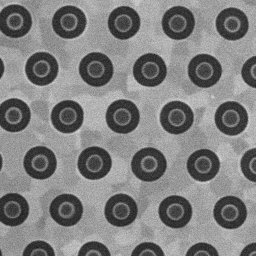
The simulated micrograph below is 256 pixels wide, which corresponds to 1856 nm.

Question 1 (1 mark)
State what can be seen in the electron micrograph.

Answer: an array of small figures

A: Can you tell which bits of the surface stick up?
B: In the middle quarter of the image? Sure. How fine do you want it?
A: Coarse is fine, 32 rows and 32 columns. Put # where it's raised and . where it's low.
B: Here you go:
####..####..#####...###...#####.
####..####...####...####..#####.
####..####..#####...###...#####.
####........#####....#...######.
#####......#######.......#######
#######...##########...#########
################################
################################
################################
...#########.....########.....##
....#######.......######.......#
##...######...##...#####...##...
###..#####...###...#####..####..
###..#####...###...####...####..
##...#####...###...#####...###..
....#######.......######........
....########......#######......#
..############.############..###
################################
################################
#######.########################
#####......########.....########
####.......#######.......#######
###...###...#####...##...######.
###...####..#####...###...#####.
###...####..#####...###...####..
###...###...#####...##....#####.
####.......######........######.
#####.....########......########
####################..##########
################################
################################